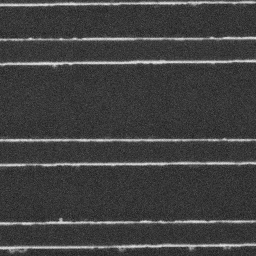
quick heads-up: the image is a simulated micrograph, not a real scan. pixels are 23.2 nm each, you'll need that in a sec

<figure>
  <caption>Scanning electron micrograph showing lines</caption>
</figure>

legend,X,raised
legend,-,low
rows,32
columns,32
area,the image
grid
XXXXXXXXXXX---------------------
--------------------------------
--------------------------------
--------------------------------
--------------------------------
XXXXXXXXXXXXXXXXXXXXXXXXXXXXXXXX
XXXXXXXXXXXXXXXXXXXXXXXXXXXXXXXX
XXXXXXXXXXXXXXXXXXXXXXXXXXXXXXXX
--------------------------------
--------------------------------
--------------------------------
--------------------------------
--------------------------------
--------------------------------
--------------------------------
--------------------------------
--------------------------------
--------------------------------
XXXXXXXXXXXXXXXXXXXXXXXXXXXXXXXX
XXXXXXXXXXXXXXXXXXXXXXXXXXXXXXXX
XXXXXXXXXXXXXXX-----------------
--------------------------------
--------------------------------
--------------------------------
--------------------------------
--------------------------------
--------------------------------
--------------------------------
XXXXXXXXXXXXXXXXXXXXXXXXXXXXXXXX
XXXXXXXXXXXXXXXXXXXXXXXXXXXXXXXX
XXXXXXXXXXXXXXXXXXXXXXXXXXXXXXXX
--------------------------------